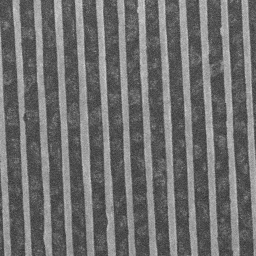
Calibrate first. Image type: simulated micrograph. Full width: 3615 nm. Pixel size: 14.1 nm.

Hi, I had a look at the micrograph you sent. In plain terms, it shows parallel lines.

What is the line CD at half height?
88.2 nanometers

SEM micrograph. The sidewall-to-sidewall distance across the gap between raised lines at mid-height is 201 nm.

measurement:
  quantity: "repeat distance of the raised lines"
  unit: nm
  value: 293